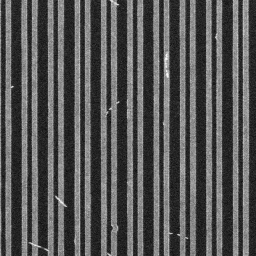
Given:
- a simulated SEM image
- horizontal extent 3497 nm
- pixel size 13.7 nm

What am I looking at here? parallel lines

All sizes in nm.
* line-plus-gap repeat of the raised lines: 180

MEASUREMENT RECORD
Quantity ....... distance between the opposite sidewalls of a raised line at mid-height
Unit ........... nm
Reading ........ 66.6